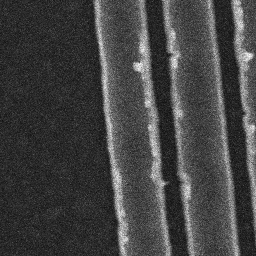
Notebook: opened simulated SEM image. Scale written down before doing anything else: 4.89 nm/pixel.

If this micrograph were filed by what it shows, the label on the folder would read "one or a few lines or trenches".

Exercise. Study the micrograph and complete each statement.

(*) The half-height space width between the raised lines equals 103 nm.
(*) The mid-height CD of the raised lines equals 47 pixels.